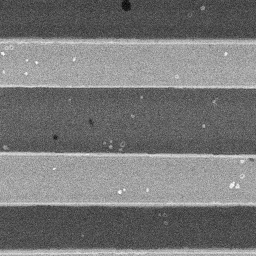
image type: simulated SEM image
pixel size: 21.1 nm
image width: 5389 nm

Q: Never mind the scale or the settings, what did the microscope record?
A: lines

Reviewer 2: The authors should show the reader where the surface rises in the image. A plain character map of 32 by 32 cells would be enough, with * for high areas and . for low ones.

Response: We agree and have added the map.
................................
................................
................................
................................
................................
********************************
********************************
********************************
********************************
********************************
********************************
................................
................................
................................
................................
................................
................................
................................
................................
**********************..........
********************************
********************************
********************************
********************************
********************************
................................
................................
................................
................................
................................
................................
................................